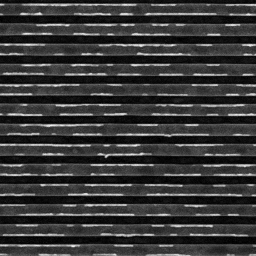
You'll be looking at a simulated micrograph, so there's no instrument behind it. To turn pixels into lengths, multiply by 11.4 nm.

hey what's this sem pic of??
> parallel lines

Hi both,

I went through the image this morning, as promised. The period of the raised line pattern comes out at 230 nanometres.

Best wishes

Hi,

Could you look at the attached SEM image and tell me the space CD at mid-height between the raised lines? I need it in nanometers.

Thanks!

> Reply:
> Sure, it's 97.2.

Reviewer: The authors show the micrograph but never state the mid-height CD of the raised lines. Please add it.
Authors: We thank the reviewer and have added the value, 11.5 px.